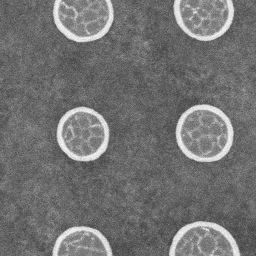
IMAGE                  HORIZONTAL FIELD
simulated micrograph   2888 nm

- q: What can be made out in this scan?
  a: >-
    raised bodies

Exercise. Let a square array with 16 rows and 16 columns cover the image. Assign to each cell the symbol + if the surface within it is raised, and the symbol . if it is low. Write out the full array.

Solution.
...++++....+++..
....+++....+++..
................
................
................
................
................
....++.....+++..
....+++....+++..
....++......++..
................
................
................
................
....++.....+++..
....+++....++++.